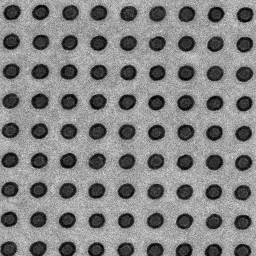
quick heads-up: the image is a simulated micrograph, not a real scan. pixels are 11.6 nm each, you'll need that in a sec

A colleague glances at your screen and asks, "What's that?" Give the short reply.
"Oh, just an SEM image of a regular array of ring-shaped grooves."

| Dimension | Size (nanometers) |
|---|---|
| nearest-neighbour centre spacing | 336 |